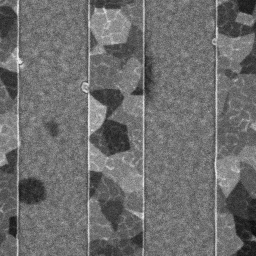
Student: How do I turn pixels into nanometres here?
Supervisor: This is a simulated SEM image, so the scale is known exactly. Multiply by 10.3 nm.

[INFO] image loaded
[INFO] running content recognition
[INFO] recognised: one or a few lines or trenches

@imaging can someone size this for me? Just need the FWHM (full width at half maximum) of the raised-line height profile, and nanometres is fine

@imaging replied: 572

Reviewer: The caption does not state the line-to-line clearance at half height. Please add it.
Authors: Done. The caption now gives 729 nm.